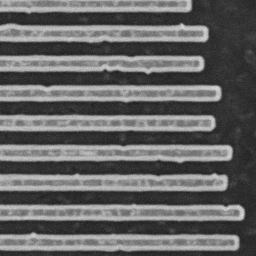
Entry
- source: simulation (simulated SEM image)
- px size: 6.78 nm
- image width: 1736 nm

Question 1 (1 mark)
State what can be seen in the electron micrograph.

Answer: parallel lines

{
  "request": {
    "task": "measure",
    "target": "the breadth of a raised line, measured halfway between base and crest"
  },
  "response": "76.2 nm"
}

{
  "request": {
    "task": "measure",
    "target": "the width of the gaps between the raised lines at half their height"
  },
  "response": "126 nanometres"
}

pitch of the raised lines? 0.202 microns